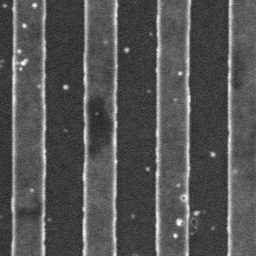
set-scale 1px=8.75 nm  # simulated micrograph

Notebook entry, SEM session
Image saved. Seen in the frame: lines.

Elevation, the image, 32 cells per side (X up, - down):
--XXXX-----XXXX-----XXXX-----XXX
--XXXX-----XXXX-----XXXX-----XXX
--XXXX-----XXXX-----XXXX-----XXX
--XXXX-----XXXX-----XXXX-----XXX
--XXXX-----XXXX-----XXXX-----XXX
--XXXX-----XXXX-----XXXX-----XXX
--XXXX-----XXXX-----XXXX-----XXX
--XXXX-----XXXX-----XXXX-----XXX
--XXXX-----XXXX-----XXXX-----XXX
--XXXX-----XXXX-----XXXX-----XXX
--XXXX-----XXXX-----XXX------XXX
--XXXX-----XXXX-----XXXX-----XXX
--XXXX-----XXX------XXXX-----XXX
--XXXX-----XXXX-----XXXX-----XXX
--XXXX-----XXX------XXXX-----XXX
--XXXX-----XXXX-----XXXX-----XXX
--XXXX-----XXX------XXXX-----XXX
--XXXX-----XXX------XXXX-----XXX
--XXXX-----XXX------XXXX-----XXX
--XXXX-----XXX------XXXX-----XXX
--XXXX-----XXXX-----XXXX-----XXX
--XXXX----XXXX------XXXX-----XXX
--XXXX----XXXX------XXXX-----XXX
--XXXX-----XXX------XXX------XXX
--XXXX-----XXX------XXX------XXX
--XXXX-----XXX------XXXX-----XXX
--XXXX----XXXX------XXXX-----XXX
--XXX-----XXXX------XXXX-----XXX
--XXXX----XXXX------XXX------XXX
--XXXX----XXXX------XXX------XXX
--XXXX----XXXX------XXX------XXX
--XXXX----XXXX------XXX------XXX